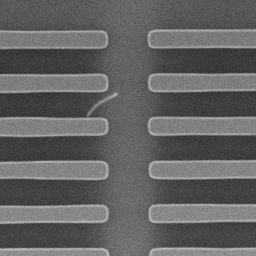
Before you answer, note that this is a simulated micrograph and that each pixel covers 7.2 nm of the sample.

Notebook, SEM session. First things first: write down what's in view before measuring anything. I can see groups of lines, slits or small figures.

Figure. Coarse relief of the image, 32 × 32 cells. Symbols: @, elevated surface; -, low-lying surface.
--------------------------------
--------------------------------
--------------------------------
--------------------------------
@@@@@@@@@@@@@------@@@@@@@@@@@@@
@@@@@@@@@@@@@------@@@@@@@@@@@@@
--------------------------------
--------------------------------
--------------------------------
@@@@@@@@@@@@@------@@@@@@@@@@@@@
@@@@@@@@@@@@@------@@@@@@@@@@@@@
@@@@----------------------------
--------------------------------
--------------------------------
--------------------------------
@@@@@@@@@@@@@------@@@@@@@@@@@@@
@@@@@@@@@@@@@------@@@@@@@@@@@@@
--------------------------------
--------------------------------
--------------------------------
@@@@@@@@@@@@@------@@@@@@@@@@@@@
@@@@@@@@@@@@@------@@@@@@@@@@@@@
--------------------------------
--------------------------------
--------------------------------
--------------------------------
@@@@@@@@@@@@@------@@@@@@@@@@@@@
@@@@@@@@@@@@@------@@@@@@@@@@@@@
--------------------------------
--------------------------------
--------------------------------
@@@@@@@@@@@@@------@@@@@@@@@@@@@